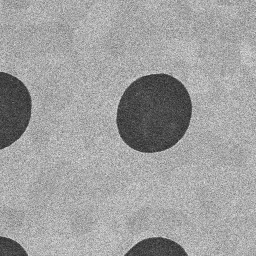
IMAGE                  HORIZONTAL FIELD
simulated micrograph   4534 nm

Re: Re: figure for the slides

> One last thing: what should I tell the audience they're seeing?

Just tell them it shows holes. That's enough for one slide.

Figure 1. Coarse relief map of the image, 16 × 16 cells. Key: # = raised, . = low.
################
################
################
################
################
..######....####
..#####.....####
..#####.....####
.#######...#####
#########.######
################
################
################
################
################
.#######...#####